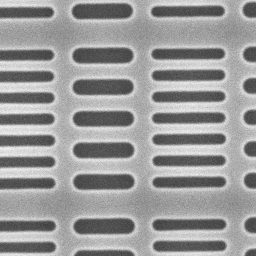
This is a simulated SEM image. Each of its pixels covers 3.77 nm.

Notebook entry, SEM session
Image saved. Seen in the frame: groups of lines, slits or small figures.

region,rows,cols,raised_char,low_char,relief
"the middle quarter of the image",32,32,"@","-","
@@@@@@@@@@@@@@@@@@@@@@@@@@@@@@@@
@@@@@@@@@@@@@@@@@@@@@@@---------
@@@@@@@@@@@@@@@@@@@@@@----------
@@@@@@@@@@@@@@@@@@@@@@----------
@@@--------------@@@@@@@--------
@@----------------@@@@@@@@@@@@@@
@@---------------@@@@@@@@@@@@@@@
@@@--------------@@@@@----------
@@@@@@@@@@@@@@@@@@@@@@----------
@@@@@@@@@@@@@@@@@@@@@@@---------
@@@@@@@@@@@@@@@@@@@@@@@@@@@@@@@@
@@@@------------@@@@@@@@@@@@@@@@
@@@--------------@@@@@----------
@@----------------@@@@----------
@@----------------@@@@----------
@@@--------------@@@@@@@@@@@@@@@
@@@@@@@@@@@@@@@@@@@@@@@@@@@@@@@@
@@@@@@@@@@@@@@@@@@@@@@@---------
@@@@@@@@@@@@@@@@@@@@@@----------
@@@@@@@@@@@-----@@@@@@----------
@@----------------@@@@@@@@@@@@@@
@@----------------@@@@@@@@@@@@@@
@@----------------@@@@@@@@@@@@@@
@@@@------------@@@@@@----------
@@@@@@@@@@@@@@@@@@@@@@----------
@@@@@@@@@@@@@@@@@@@@@@@---------
@@@@@@@@@@@@@@@@@@@@@@@@@@@@@@@@
@@@@------------@@@@@@@@@@@@@@@@
@@----------------@@@@@---------
@@----------------@@@@----------
@@----------------@@@@----------
@@@@---------@@@@@@@@@@@@@@@@@@@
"